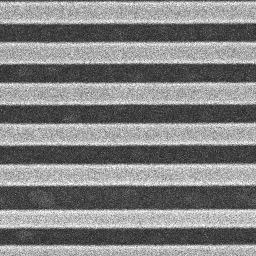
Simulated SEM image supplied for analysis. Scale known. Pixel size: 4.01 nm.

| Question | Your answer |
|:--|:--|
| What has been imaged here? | parallel lines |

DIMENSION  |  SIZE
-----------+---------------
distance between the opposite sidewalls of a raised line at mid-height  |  84.2 nm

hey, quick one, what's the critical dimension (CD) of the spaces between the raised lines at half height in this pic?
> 80.7 nanometres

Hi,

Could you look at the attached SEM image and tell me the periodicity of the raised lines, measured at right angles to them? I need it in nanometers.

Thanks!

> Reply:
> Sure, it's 166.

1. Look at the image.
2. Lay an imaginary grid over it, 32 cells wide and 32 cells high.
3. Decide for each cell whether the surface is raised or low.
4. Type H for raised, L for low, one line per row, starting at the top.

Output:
HHHHHHHHHHHHHHHHHHHHHHHHHHHHHHHH
HHHHHHHHHHHHHHHHHHHHHHHHHHHHHHHH
HHHHHHHHHHHHHHHHHHHHHHHHHHHHHHHH
LLLLLLLLLLLLLLLLLLLLLLLLLLLLLLLL
LLLLLLLLLLLLLLLLLLLLLLLLLLLLLLLL
HHHHHHHHHHHHHHHHHHHHHHHHHHHHHHHH
HHHHHHHHHHHHHHHHHHHHHHHHHHHHHHHH
HHHHHHHHHHHHHHHHHHHHHHHHHHHHHHHH
LLLLLLLLLLLLLLLLLLLLLLLLLLLLLLLL
LLLLLLLLLLLLLLLLLLLLLLLLLLLLLLLL
HHHHHHHHHHHHHHHHHHHHHHHHHHHHHHHH
HHHHHHHHHHHHHHHHHHHHHHHHHHHHHHHH
HHHHHHHHHHHHHHHHHHHHHHHHHHHHHHHH
LLLLLLLLLLLLLLLLLLLLLLLLLLLLLLLL
LLLLLLLLLLLLLLLLLLLLLLLLLLLLLLLL
LLLLLLLLLLLLLLLLLLLLLLLLLLLLLLHL
HHHHHHHHHHHHHHHHHHHHHHHHHHHHHHHH
HHHHHHHHHHHHHHHHHHHHHHHHHHHHHHHH
LLLLLLLLLLLLLLLLLLLLLLLLLLLLLLLL
LLLLLLLLLLLLLLLLLLLLLLLLLLLLLLLL
LLLLLLLLLLLLLLLLLLLLLLLLLLLLLLLL
HHHHHHHHHHHHHHHHHHHHHHHHHHHHHHHH
HHHHHHHHHHHHHHHHHHHHHHHHHHHHHHHH
LLLLLLLLLLLLLLLLLLLLLLLLLLLLLLLL
LLLLLLLLLLLLLLLLLLLLLLLLLLLLLLLL
LLLLLLLLLLLLLLLLLLLLLLLLLLLLLLLL
HHHHHHHHHHHHHHHHHHHHHHHHHHHHHHHH
HHHHHHHHHHHHHHHHHHHHHHHHHHHHHHHH
LLLLLLLLLLLLLLLLLLLLLLLLLLLLLLLL
LLLLLLLLLLLLLLLLLLLLLLLLLLLLLLLL
LLLLLLLLLLLLLLLLLLLLLLLLLLLLLLLL
HHHHHHHHHHHHHHHHHHHHHHHHHHHHHHHH